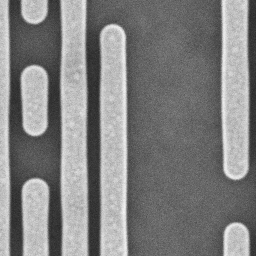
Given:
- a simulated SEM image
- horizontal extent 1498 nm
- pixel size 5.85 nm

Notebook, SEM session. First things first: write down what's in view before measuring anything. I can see groups of lines, slits or small figures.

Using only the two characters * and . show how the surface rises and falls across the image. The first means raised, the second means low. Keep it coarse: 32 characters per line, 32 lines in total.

*..***..***.................***.
*..***..***.................***.
*..**...***.................***.
*.......***..**.............***.
*.......***..***............***.
*.......***..***............***.
*.......***..***............***.
*.......***..***............***.
*...*...***..***............***.
*..***..***..***............***.
*..***..***..***............***.
*..***..***..***............***.
*..***..***..***............***.
*..***..***..***............***.
*..***..***..***............***.
*..***..***..***............***.
*..**...***..***............***.
*.......***..***............***.
*.......***..***............***.
*.......***..***............***.
*.......***..***............***.
*.......***..***............***.
*...*...***..***................
*..***..***..***................
*..***..***..***................
*..***..***..***................
*..***..***..***................
*..***..***..***................
*..***..***..***.............**.
*..***..***..***............***.
*..***..***..***............***.
*..***..***..***............***.